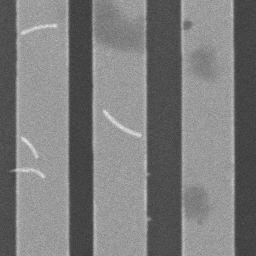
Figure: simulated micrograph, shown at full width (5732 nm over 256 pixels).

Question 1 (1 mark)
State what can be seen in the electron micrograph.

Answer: lines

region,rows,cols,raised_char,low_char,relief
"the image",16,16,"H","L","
LHHHLLHHHLLHHHHL
LHHHLLHHHLLHHHHL
LHHHLLHHHLLHHHHL
LHHHLLHHHLLHHHHL
LHHHLLHHHLLHHHHL
LHHHLLHHHLLHHHHL
LHHHLLHHHLLHHHHL
LHHHLLHHHLLHHHHL
LHHHLLHHHLLHHHHL
LHHHLLHHHLLHHHHL
LHHHLLHHHLLHHHHL
LHHHLLHHHLLHHHHL
LHHHLLHHHLLHHHHL
LHHHLLHHHLLHHHHL
LHHHLLHHHLLHHHHL
LHHHLLHHHLLHHHHL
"